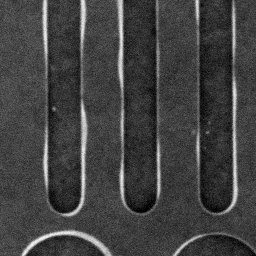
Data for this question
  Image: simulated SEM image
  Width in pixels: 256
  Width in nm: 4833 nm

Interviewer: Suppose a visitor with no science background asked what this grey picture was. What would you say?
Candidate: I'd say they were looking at groups of lines, slits or small figures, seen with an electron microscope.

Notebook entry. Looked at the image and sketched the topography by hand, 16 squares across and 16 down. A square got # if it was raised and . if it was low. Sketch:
###..###..##...#
###..###..##...#
###..###..##...#
###..###..##...#
###..###..##...#
###..###..##...#
###..###..##...#
###..###..##...#
###..###..##...#
###..###..##...#
###..###..##...#
###..###..##...#
###..###..###..#
################
################
##....#####.....